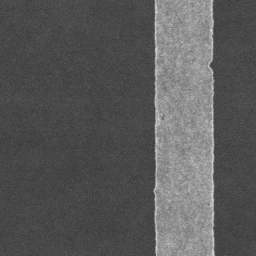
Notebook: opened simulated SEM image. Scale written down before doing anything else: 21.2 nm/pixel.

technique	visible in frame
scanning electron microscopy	one or a few lines or trenches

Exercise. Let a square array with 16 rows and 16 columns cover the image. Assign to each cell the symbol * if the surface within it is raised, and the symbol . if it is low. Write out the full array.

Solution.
..........***...
..........***...
..........***...
..........***...
..........***...
...........**...
...........**...
...........**...
..........***...
..........***...
..........***...
..........***...
..........**....
..........***...
..........***...
..........***...